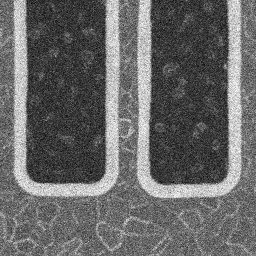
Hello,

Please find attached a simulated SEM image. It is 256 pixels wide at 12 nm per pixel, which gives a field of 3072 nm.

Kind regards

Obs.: one or a few lines or trenches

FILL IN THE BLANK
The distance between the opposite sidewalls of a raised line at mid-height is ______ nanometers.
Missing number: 372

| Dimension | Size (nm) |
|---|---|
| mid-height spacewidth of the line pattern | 1100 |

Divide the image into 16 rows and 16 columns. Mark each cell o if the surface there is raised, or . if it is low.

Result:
o......oo......o
o......oo......o
o......oo......o
o......oo......o
o......oo......o
o......oo......o
o......oo......o
o......oo......o
o......oo......o
o......oo......o
o......oo......o
oo.....oo.....oo
oooooooooooooooo
oooooooooooooooo
oooooooooooooooo
oooooooooooooooo